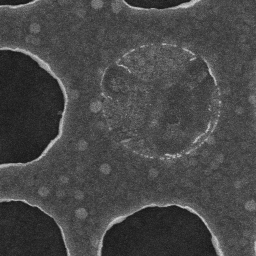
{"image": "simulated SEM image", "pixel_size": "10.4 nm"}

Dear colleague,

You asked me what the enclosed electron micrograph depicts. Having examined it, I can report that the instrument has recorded holes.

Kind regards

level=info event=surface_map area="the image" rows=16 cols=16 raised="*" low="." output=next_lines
*********..*****
****************
****************
..**************
...*************
....************
....************
....************
....************
...*************
****************
****************
****************
...*****....****
....***......***
....**........**